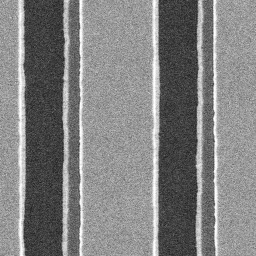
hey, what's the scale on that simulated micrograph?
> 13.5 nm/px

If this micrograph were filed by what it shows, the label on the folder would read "lines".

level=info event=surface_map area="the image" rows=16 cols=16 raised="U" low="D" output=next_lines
UDDDUUUUUUDDDUUU
UDDDUUUUUUDDDUUU
UDDDUUUUUUDDDUUU
UDDDUUUUUUDDDUUU
UDDDUUUUUUDDDUUU
UDDDUUUUUUDDDUUU
UDDDUUUUUUDDDUUU
UDDDUUUUUUDDDUUU
UDDDUUUUUUDDDUUU
UDDDUUUUUUDDDUUU
UDDDUUUUUUDDDUUU
UDDDUUUUUUDDDUUU
UDDDUUUUUUDDDUUU
UDDDUUUUUUDDDUUU
UDDDUUUUUUDDDUUU
UDDDUUUUUUDDDUUU